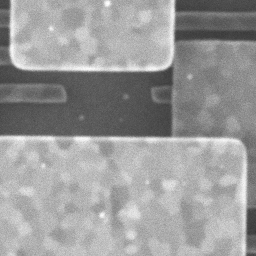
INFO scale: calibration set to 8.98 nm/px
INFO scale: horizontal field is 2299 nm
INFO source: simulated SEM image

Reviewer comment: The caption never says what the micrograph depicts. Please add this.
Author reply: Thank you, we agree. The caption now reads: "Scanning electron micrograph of wiring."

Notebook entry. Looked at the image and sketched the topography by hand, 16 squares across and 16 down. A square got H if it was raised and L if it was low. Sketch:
LHHHHHHHHHHLLLLL
LHHHHHHHHHHLLLLL
LHHHHHHHHHHLLLLL
LHHHHHHHHHHLLLLL
LLLLLLLLLLLLLLLL
LLLLLLLLLLLLLLLL
LLLLLLLLLLLLLLLL
LLLLLLLLLLLLLLLL
LLLLLLLLLLLLLLLL
HHHHHHHHHHHHHHHL
HHHHHHHHHHHHHHHL
HHHHHHHHHHHHHHHL
HHHHHHHHHHHHHHHL
HHHHHHHHHHHHHHHL
HHHHHHHHHHHHHHHL
HHHHHHHHHHHHHHHL